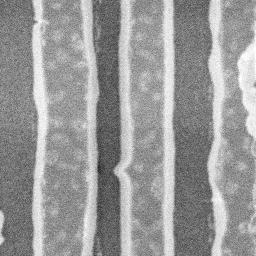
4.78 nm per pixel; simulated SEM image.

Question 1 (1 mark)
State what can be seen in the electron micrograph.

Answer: one or a few lines or trenches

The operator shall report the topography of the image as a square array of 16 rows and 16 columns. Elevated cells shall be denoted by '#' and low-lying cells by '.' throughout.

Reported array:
..###...###..###
..####..###..###
..####..###..###
..####..###..###
..####..###...##
..####..###...##
...###..###...##
...###..###...##
...###..###..###
..####..###..###
..####..###..###
..####..###..###
..####..###...##
..####..##....##
..####..###...##
..###...###...##